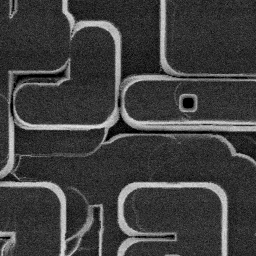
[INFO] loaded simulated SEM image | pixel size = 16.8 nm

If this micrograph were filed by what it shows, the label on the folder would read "wiring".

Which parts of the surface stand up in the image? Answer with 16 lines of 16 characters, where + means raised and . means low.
++++......++++++
++++++....++++++
+++++++...++++++
+++++++...++++++
+++++++....+++++
++++++++++++++++
+++++++++++.++++
+++++++.++++++++
+...............
+...............
+...............
+...............
++++....++++++..
++++....++++++..
++++....++++++..
++++....++++++..